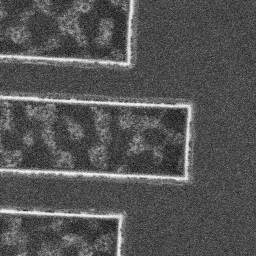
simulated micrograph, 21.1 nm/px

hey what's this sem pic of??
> one or a few lines or trenches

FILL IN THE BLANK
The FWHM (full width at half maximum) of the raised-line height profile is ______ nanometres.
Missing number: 858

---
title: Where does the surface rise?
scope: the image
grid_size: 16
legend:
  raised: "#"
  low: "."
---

........########
........########
........########
........########
################
################
........########
............####
............####
............####
............####
################
################
......##########
.......#########
.......#########